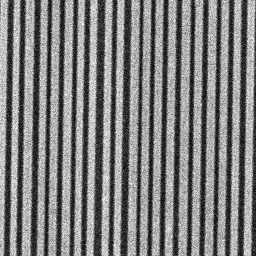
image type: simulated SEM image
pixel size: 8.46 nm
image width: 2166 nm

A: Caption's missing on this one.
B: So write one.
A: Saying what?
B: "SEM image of parallel lines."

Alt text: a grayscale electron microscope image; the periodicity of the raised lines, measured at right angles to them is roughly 110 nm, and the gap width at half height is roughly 52.9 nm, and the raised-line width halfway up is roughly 59.2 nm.